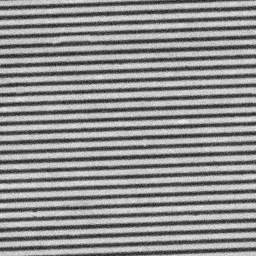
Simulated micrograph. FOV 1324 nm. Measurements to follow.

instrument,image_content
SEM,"parallel lines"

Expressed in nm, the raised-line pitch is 49.8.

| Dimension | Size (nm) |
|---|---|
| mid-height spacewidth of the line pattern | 27.1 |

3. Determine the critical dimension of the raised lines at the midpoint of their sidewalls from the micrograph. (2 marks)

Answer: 22.6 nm